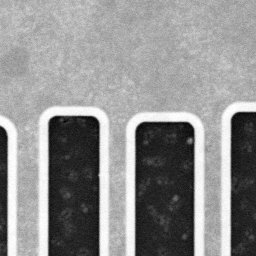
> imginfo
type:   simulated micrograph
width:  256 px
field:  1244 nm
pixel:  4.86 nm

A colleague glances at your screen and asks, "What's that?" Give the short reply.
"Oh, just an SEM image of one or a few lines or trenches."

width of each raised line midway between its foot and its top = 136 nm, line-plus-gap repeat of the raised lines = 449 nm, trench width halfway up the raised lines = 291 nanometers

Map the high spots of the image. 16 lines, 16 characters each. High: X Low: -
XXXXXXXXXXXXXXXX
XXXXXXXXXXXXXXXX
XXXXXXXXXXXXXXXX
XXXXXXXXXXXXXXXX
XXXXXXXXXXXXXXXX
XXXXXXXXXXXXXXXX
XXXXXXXXXXXXXXXX
XXX---XXX---XX--
-XX---XX----XX--
-XX---XX----XX--
-XX---XX----XX--
-XX---XX----XX--
-XX----X----XX--
-XX----X----XX--
-XX----X----XX--
-XX----X----XX--